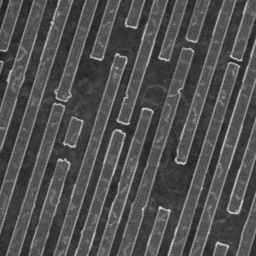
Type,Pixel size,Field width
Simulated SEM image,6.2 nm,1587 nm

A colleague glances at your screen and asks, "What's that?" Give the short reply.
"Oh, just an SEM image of parallel lines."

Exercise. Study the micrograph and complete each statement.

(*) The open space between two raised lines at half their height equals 67.3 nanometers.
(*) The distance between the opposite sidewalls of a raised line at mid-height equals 73.3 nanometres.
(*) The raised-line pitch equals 138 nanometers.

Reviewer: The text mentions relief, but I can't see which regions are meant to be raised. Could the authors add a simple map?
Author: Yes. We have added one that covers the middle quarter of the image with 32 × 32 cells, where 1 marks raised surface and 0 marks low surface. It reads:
11100000000011100011100000001110
11100000000011100111000000001110
11100000000011100111000000001110
11000000000111000111000000011100
11000000000111001110000000011100
11000000000111001110000000011100
10000000001110001110000000111000
11000000001110001100000000111000
10000000001100011100000000111000
00000000011100011100000001110000
00000000011100111100000001110000
00000000011100111000100001110001
00000000111000111001110011110001
00100000111000111001110011100001
00111000111000110001100011100001
01110001110000000011100011100011
01110001110000000011100111000011
01110001110011100011100111000011
11100001100011100111000111000111
11100011100011100111001110000111
01100011100111000111001110000111
00000011000111001110001110001110
00000111000111001110011100001110
00000111001111001110011100001110
10000111001110001100011100001100
10001110001110011100011000000000
10001110011110011100111000000000
10001110011100011000111000000000
00011110011100111001111000000000
00011100011100111001110000000000
00011100111000111001110000000000
00011100111000110001110000000001